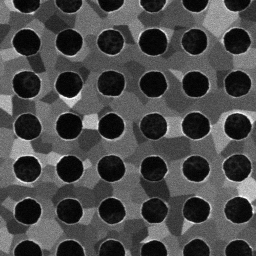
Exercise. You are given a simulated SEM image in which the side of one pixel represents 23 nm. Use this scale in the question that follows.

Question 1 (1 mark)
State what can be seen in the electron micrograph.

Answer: a regular array of holes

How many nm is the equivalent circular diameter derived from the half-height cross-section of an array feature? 619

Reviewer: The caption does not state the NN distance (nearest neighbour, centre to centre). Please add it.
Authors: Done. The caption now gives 956 nanometres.